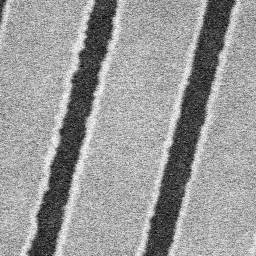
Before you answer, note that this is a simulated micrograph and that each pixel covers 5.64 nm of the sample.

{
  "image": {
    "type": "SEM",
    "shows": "one or a few lines or trenches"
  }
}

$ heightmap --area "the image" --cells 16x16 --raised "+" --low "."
++++++.++++++..+
+++++..+++++..++
+++++..+++++..++
+++++..+++++..++
++++..++++++..++
++++..+++++..+++
++++..+++++..+++
++++..+++++..+++
+++..++++++..+++
+++..+++++..++++
+++..+++++..++++
+++..+++++..++++
++..++++++..++++
++..+++++..+++++
++..+++++..+++++
++..+++++..+++++